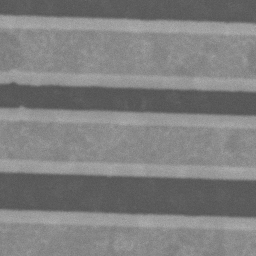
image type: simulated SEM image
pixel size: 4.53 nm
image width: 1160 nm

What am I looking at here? one or a few lines or trenches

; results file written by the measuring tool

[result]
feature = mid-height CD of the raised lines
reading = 236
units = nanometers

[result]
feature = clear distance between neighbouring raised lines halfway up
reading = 0.205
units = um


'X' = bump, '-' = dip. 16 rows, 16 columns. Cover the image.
----------------
XXXX------------
XXXXXXXXXXXXXXXX
XXXXXXXXXXXXXXXX
XXXXXXXXXXXXXXXX
----------------
----------------
XXXXXXXXXXX-----
XXXXXXXXXXXXXXXX
XXXXXXXXXXXXXXXX
-----XXXXXXXXXXX
----------------
----------------
----------------
XXXXXXXXXXXXXXXX
XXXXXXXXXXXXXXXX